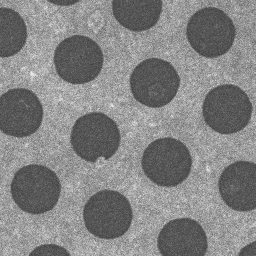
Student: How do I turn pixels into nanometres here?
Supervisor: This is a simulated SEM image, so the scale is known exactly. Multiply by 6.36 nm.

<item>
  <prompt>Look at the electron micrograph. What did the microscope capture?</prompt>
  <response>a regular array of holes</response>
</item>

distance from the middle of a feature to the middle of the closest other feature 0.485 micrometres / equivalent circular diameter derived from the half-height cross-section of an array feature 317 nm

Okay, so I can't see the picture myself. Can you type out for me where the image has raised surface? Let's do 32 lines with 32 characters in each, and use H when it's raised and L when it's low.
HHHHHHHLLHHHHHLLLLLLHHHHHHHHHHHH
LLHHHHHHHHHHHHLLLLLLHHHHHLLLHHHH
LLLHHHHHHHHHHHHLLLLLHHHHLLLLLHHH
LLLHHHHHHHHHHHHHLLLHHHHLLLLLLHHH
LLLHHHHHHLLHHHHHHHHHHHHLLLLLLHHH
LLLHHHHLLLLLHHHHHHHHHHHHLLLLLHHH
LLHHHHHLLLLLLHHHHHHHHHHHHLLLHHHH
HHHHHHHLLLLLLHHHHHLLLHHHHHHHHHHH
HHHHHHHLLLLLLHHHHLLLLLHHHHHHHHHH
HHHHHHHLLLLLHHHHLLLLLLHHHHHHHHHH
HHHHHHHHHLHHHHHHLLLLLLHHHHHHHHHH
HLLLHHHHHHHHHHHHLLLLLLHHHHLLLLLH
LLLLLHHHHHHHHHHHHLLLLLHHHHLLLLLH
LLLLLHHHHHHHHHHHHHHHHHHHHLLLLLLL
LLLLLHHHHHLLLHHHHHHHHHHHHLLLLLLH
LLLLLHHHHLLLLLLHHHHHHHHHHHLLLLLH
LLLLHHHHHLLLLLLHHHHHHHHHHHHLLLHH
HHHHHHHHHLLLLLLHHHHLLLHHHHHHHHHH
HHHHHHHHHLLLLLLHHHLLLLLHHHHHHHHH
HHHHHHHHHHLLLLHHHHLLLLLLHHHHHHHH
HHHHHHHHHHHHHHHHHHLLLLLLHHHHHLLL
HHLLLLLHHHHHHHHHHHLLLLLLHHHHLLLL
HHLLLLLHHHHHHHHHHHHLLLLHHHHLLLLL
HLLLLLLLHHHHHHHHHHHHHHHHHHHLLLLL
HLLLLLLHHHHHLLLLHHHHHHHHHHHHLLLL
HHLLLLLHHHHLLLLLHHHHHHHHHHHHLLLL
HHHLLLHHHHLLLLLLLHHHHHHHHHHHHHHH
HHHHHHHHHHLLLLLLHHHHHHLLHHHHHHHH
HHHHHHHHHHHLLLLLHHHHLLLLLHHHHHHH
HHHHHHHHHHHHLLLHHHHHLLLLLLHHHHHH
HHHHHHHHHHHHHHHHHHHHLLLLLLHHHHHL
HHHHLLLLLHHHHHHHHHHHLLLLLLHHHHLL